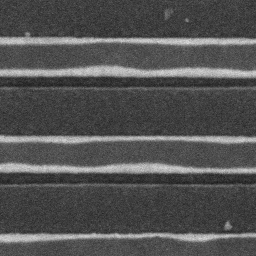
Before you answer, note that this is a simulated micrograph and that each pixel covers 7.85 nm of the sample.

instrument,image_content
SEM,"lines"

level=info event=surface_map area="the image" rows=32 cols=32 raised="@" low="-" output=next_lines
--------------------------------
--------------------------------
--------------------------------
--------------------------------
--------------------------------
@@@@@@@@@@@@@@@@@@@@@@@@@@@@@@@@
@@@@@@@@@@@@@@@@@@@@@@@@@@@@@@@@
@@@@@@@@@@@@@@@@@@@@@@@@@@@@@@@@
@@@@@@@@@@@@@@@@@@@@@@@@@@@@@@@@
--------------------------------
--------------------------------
--------------------------------
--------------------------------
--------------------------------
--------------------------------
--------------------------------
--------------------------------
@@@@@@@@@@@@@@@@@@@@@@@@@@@@@@@@
@@@@@@@@@@@@@@@@@@@@@@@@@@@@@@@@
@@@@@@@@@@@@@@@@@@@@@@@@@@@@@@@@
@@@@@@@@@@@@@@@@@@@@@@@@@@@@@@@@
--------------------------------
--------------------------------
--------------------------------
--------------------------------
--------------------------------
--------------------------------
--------------------------------
--------------------------------
-@@-@@@@@@@@@@@@@@@@@@@@@@@@@@@@
@@@@@@@@@@@@@@@@@@@@@@@@@@@@@@@@
@@@@@@@@@@@@@@@@@@@@@@@@@@@@@@@@